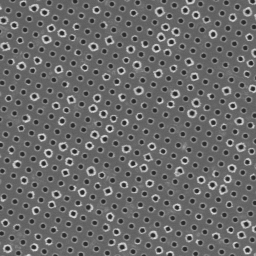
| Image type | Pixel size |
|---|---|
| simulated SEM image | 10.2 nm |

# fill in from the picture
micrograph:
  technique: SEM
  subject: a regular array of holes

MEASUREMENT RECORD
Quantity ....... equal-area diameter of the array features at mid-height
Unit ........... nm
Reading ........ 47.5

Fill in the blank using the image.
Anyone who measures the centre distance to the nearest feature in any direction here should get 115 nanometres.